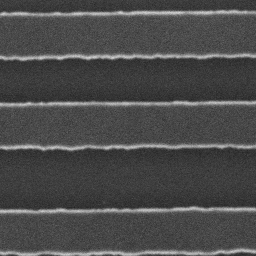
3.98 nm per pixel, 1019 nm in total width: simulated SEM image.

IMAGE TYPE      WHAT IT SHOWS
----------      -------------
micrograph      lines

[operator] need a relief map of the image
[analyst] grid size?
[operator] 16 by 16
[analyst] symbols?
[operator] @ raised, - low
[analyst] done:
----------------
@@@@@@@@@@@@@@@@
@@@@@@@@@@@@@@@@
@@@@@@@@@@@@@@@@
----------------
----------------
@@@@@@@@@@@@@@@@
@@@@@@@@@@@@@@@@
@@@@@@@@@@@@@@@@
----------------
----------------
----------------
----------------
@@@@@@@@@@@@@@@@
@@@@@@@@@@@@@@@@
@@@@@@@@@@@@@@@@